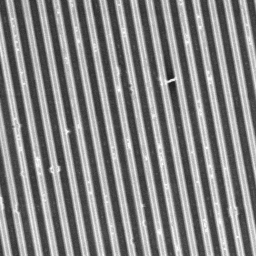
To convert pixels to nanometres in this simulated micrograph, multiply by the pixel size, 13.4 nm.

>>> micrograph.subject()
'parallel lines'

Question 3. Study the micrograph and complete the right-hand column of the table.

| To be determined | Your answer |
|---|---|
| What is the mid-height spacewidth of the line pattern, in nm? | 128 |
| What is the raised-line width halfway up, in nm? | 76.1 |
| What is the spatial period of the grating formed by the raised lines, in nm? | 206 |